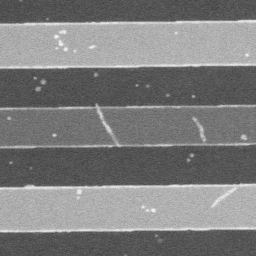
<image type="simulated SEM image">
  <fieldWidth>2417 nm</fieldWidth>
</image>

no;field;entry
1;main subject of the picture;lines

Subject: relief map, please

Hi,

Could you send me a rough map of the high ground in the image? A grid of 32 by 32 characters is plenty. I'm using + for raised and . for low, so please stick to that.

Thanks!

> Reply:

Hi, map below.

................................
................................
................................
++++++++++++++++++++++++++++++++
++++++++++++++++++++++++++++++++
++++++++++++++++++++++++++++++++
++++++++++++++++++++++++++++++++
++++++++++++++++++++++++++++++++
................................
................................
................................
................................
................................
.......+++++++++++++++++++++++++
++++++++++++++++++++++++++++++++
++++++++++++++++++++++++++++++++
++++++++++++++++++++++++++++++++
++++++++++++++++++++++++++++++++
................................
................................
................................
................................
................................
...+++++++++++++++++++++++++++++
++++++++++++++++++++++++++++++++
++++++++++++++++++++++++++++++++
++++++++++++++++++++++++++++++++
++++++++++++++++++++++++++++++++
++++++++++++++++++++++++++++++++
................................
................................
................................